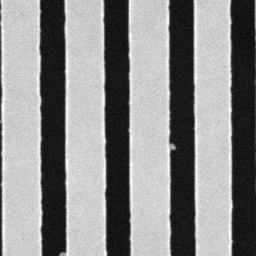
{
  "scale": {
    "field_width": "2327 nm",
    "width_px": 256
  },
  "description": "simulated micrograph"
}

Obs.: lines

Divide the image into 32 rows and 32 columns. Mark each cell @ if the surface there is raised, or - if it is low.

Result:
@@@@@---@@@@@---@@@@@---@@@@@---
@@@@@---@@@@@---@@@@@---@@@@@---
@@@@@---@@@@@---@@@@@---@@@@@---
@@@@@---@@@@@---@@@@@---@@@@@---
@@@@@---@@@@@---@@@@@---@@@@@---
@@@@@---@@@@@---@@@@@---@@@@@---
@@@@@---@@@@@---@@@@@---@@@@@---
@@@@@---@@@@@---@@@@@---@@@@@---
@@@@@---@@@@@---@@@@@---@@@@@---
@@@@@---@@@@@---@@@@@---@@@@@---
@@@@@---@@@@@---@@@@@---@@@@@---
@@@@@---@@@@@---@@@@@---@@@@@---
@@@@@---@@@@@---@@@@@---@@@@@---
@@@@@---@@@@@---@@@@@---@@@@@---
@@@@@---@@@@@---@@@@@---@@@@@---
@@@@@---@@@@@---@@@@@---@@@@@---
@@@@@---@@@@@---@@@@@---@@@@@---
@@@@@---@@@@@---@@@@@---@@@@@---
@@@@@---@@@@@---@@@@@---@@@@@---
@@@@@---@@@@@---@@@@@---@@@@@---
@@@@@---@@@@@---@@@@@---@@@@@---
@@@@@---@@@@@---@@@@@---@@@@@---
@@@@@---@@@@@---@@@@@---@@@@@---
@@@@@---@@@@@---@@@@@---@@@@@---
@@@@@---@@@@@---@@@@@---@@@@@---
@@@@@---@@@@@---@@@@@---@@@@@---
@@@@@---@@@@@---@@@@@----@@@@---
@@@@@---@@@@@---@@@@@---@@@@@---
@@@@@---@@@@@---@@@@@---@@@@@---
@@@@@---@@@@@---@@@@@---@@@@@---
@@@@@---@@@@@---@@@@@----@@@@---
@@@@@---@@@@@---@@@@@----@@@@---